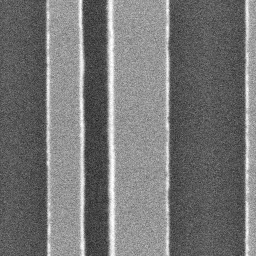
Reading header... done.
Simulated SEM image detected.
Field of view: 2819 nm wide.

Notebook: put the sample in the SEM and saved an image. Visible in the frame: lines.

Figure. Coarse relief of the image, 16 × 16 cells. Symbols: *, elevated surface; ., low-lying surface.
...**..***.....*
...**..***.....*
...**..***.....*
...**..***.....*
...**..***.....*
...**..***.....*
...**..***.....*
...**..***.....*
...**..***.....*
...**..***.....*
...**..***.....*
...**..***.....*
...**..***.....*
...**..***.....*
...**..***.....*
...**..***.....*